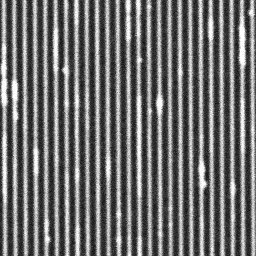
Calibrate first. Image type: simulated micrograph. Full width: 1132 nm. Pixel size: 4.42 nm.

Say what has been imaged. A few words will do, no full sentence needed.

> parallel lines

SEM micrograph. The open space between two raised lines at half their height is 0.0315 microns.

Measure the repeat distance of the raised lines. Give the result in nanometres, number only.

45.8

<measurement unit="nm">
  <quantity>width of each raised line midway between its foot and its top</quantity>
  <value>12.2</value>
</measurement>